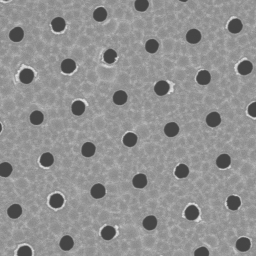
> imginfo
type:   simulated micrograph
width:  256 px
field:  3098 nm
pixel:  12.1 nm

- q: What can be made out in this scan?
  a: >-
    a regular array of holes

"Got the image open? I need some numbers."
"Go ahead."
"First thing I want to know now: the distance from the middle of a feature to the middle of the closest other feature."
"516 nm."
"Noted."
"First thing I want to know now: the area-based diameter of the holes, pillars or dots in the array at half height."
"0.18 microns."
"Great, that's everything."